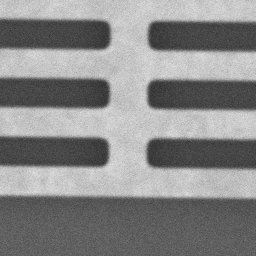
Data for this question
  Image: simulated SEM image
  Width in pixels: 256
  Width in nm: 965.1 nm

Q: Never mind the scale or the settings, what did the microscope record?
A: groups of lines, slits or small figures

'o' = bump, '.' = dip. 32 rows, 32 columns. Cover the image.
oooooooooooooooooooooooooooooooo
oooooooooooooooooooooooooooooooo
.............ooooooooooooooooooo
..............ooooo.............
..............oooo..............
..............ooooo.............
ooooooooooooooooooooooooooooo...
oooooooooooooooooooooooooooooooo
oooooooooooooooooooooooooooooooo
oooooooooooooooooooooooooooooooo
..............ooooo.............
..............oooo..............
..............oooo..............
.............oooooo.............
oooooooooooooooooooooooooooooooo
oooooooooooooooooooooooooooooooo
oooooooooooooooooooooooooooooooo
.............oooooo.............
..............oooo..............
..............oooo..............
.............ooooo..............
oooooooooooooooooooooooooooooooo
oooooooooooooooooooooooooooooooo
oooooooooooooooooooooooooooooooo
................oooooooooooooooo
................................
................................
................................
................................
................................
................................
................................